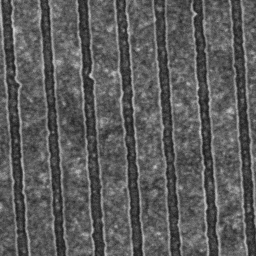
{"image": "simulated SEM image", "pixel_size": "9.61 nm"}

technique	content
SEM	parallel lines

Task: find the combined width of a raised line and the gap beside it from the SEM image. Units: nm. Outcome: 366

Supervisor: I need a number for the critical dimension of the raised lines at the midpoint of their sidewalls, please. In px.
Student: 28.4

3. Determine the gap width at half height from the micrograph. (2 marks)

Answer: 97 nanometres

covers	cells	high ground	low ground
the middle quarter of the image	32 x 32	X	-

XXXXX--XXXXXXX---XXXXXXX--XXXXXX
XXXX---XXXXXXX---XXXXXXX--XXXXXX
XXXX---XXXXXXX---XXXXXXX--XXXXXX
XXXXX--XXXXXXX---XXXXXXX---XXXXX
XXXXX---XXXXXX---XXXXXXX--XXXXXX
XXXXX--XXXXXXX---XXXXXXX--XXXXXX
XXXXX--XXXXXXX---XXXXXXX---XXXXX
XXXXX--XXXXXXXX--XXXXXXX---XXXXX
XXXXX---XXXXXX---XXXXXXX---XXXXX
XXXXX---XXXXXX---XXXXXXX---XXXXX
XXXXX---XXXXXX---XXXXXXX---XXXXX
XXXXX---XXXXXX---XXXXXXX---XXXXX
XXXXX---XXXXXX---XXXXXXX---XXXXX
XXXXX---XXXXXXX---XXXXXX---XXXXX
XXXXX---XXXXXXX--XXXXXXX---XXXXX
XXXXX---XXXXXXX--XXXXXXXX--XXXXX
XXXXX---XXXXXXX---XXXXXXX--XXXXX
XXXXX---XXXXXXX---XXXXXXX--XXXXX
XXXXXX--XXXXXXX---XXXXXXX--XXXXX
XXXXXX--XXXXXXX---XXXXXXX--XXXXX
XXXXXX--XXXXXXX---XXXXXXX---XXXX
XXXXXX--XXXXXXXX--XXXXXXX---XXXX
XXXXXX---XXXXXXX--XXXXXXX---XXXX
XXXXXX---XXXXXXX--XXXXXXX---XXXX
XXXXXX---XXXXXXX--XXXXXXX---XXXX
XXXXXX---XXXXXXX--XXXXXXXX--XXXX
XXXXXX---XXXXXXX--XXXXXXXX--XXXX
XXXXXX---XXXXXXX---XXXXXX---XXXX
XXXXXX---XXXXXXX---XXXXXX---XXXX
XXXXXXX--XXXXXXX--XXXXXXXX--XXXX
XXXXXXX--XXXXXXX--XXXXXXXX--XXXX
XXXXXX---XXXXXXX---XXXXXXX--XXXX